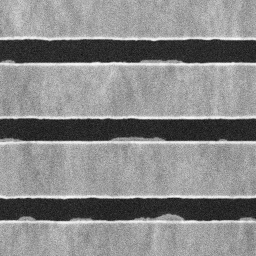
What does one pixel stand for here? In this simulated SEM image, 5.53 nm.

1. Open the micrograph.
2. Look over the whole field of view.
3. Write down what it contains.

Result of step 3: lines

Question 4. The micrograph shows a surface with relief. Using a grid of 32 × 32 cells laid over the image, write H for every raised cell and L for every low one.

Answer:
HHHHHHHHHHHHHHHHHHHHHHHHHHHHHHHH
HHHHHHHHHHHHHHHHHHHHHHHHHHHHHHHH
HHHHHHHHHHHHHHHHHHHHHHHHHHHHHHHH
HHHHHHHHHHHHHHHHHHHHHHHHHHHHHHHH
HHHHHHHHHHHHHHHHHHHHHHHHHHHHHHHH
LLLLLLLLLLLLLLLLLLLLLLLLLLLLLLLL
LLLLLLLLLLLLLLLLLLLLLLLLLLLLLLLL
LLLLLLLLLLLLLLLLLLLLLLLLLLLLLLLL
HHHHHHHHHHHHHHHHHHHHHHHHHHHHHHHH
HHHHHHHHHHHHHHHHHHHHHHHHHHHHHHHH
HHHHHHHHHHHHHHHHHHHHHHHHHHHHHHHH
HHHHHHHHHHHHHHHHHHHHHHHHHHHHHHHH
HHHHHHHHHHHHHHHHHHHHHHHHHHHHHHHH
HHHHHHHHHHHHHHHHHHHHHHHHHHHHHHHH
HHHHHHHHHHHHHHHHHHHHHHHHHHHHHHHH
LLLLLLLLLLLLLLLLLLLLLLLLLLLLLLLL
LLLLLLLLLLLLLLLLLLLLLLLLLLLLLLLL
LLLLLLLLLLLLLLLLLLLLLLLLLLLLLLLL
HHHHHHHHHHHHHHHHHHHHHHHHHHHHHHHH
HHHHHHHHHHHHHHHHHHHHHHHHHHHHHHHH
HHHHHHHHHHHHHHHHHHHHHHHHHHHHHHHH
HHHHHHHHHHHHHHHHHHHHHHHHHHHHHHHH
HHHHHHHHHHHHHHHHHHHHHHHHHHHHHHHH
HHHHHHHHHHHHHHHHHHHHHHHHHHHHHHHH
HHHHHHHHHHHHHHHHHHHHHHHHHHHHHHHH
LLLLLLLLLLLLLLLLLLLLLLLLLLLLLLLL
LLLLLLLLLLLLLLLLLLLLLLLLLLLLLLLL
LLLLLLLLLLLLLLLLLLLLLLLLLLLLLLLL
HHHHHHHHHHHHHHHHHHHHHHHHHHHHHHHH
HHHHHHHHHHHHHHHHHHHHHHHHHHHHHHHH
HHHHHHHHHHHHHHHHHHHHHHHHHHHHHHHH
HHHHHHHHHHHHHHHHHHHHHHHHHHHHHHHH